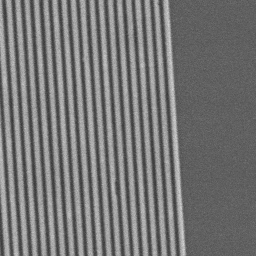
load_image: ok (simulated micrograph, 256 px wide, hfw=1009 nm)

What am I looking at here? parallel lines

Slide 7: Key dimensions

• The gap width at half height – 0.0206 µm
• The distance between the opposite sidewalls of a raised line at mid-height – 17.2 nm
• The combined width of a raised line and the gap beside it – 36.3 nm